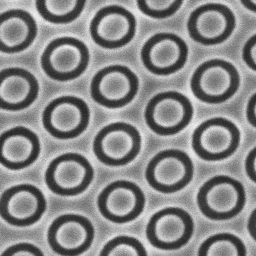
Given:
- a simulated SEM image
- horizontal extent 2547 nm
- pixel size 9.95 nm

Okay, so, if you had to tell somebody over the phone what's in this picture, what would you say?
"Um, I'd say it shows a regular array of ring-shaped grooves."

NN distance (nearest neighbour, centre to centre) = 0.559 microns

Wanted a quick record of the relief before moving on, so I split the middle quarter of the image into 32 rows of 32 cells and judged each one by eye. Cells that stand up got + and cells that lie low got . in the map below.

+++...+++++.....++++...+++....++
++...++++........++++........+++
.....+++...+++....++++.....+++++
...++++...++++++..++++++++++++++
.++++++..+++++++...+++++++++++++
+++++++..+++++++...++++++++++++.
+++++++..+++++++...+++++++++++++
+++++++...++++++..+++++.......++
....+++....+++....++++.........+
.....+++.........++++...+++++...
++....++++.....++++++..++++++...
++++..++++++++++++++...+++++++..
++++...+++++++++++++...+++++++..
++++...+++++++++++++...++++++...
++++..+++++++..+++++...++++++...
+++...++++.......++++....++....+
++...++++.........++++........++
....++++...+++++...++++.....++++
...+++++..+++++++..+++++++++++++
+++++++...+++++++..+++++++++++++
+++++++...+++++++..+++++++++++++
+++++++...++++++...++++++....+++
....++++...++++....++++........+
.....+++....++....++++..........
.++...+++........++++...+++++...
++++...++++....++++++..+++++++..
+++++..+++++++++++++...+++++++..
+++++...++++++++++++...+++++++..
+++++..+++++++++++++...++++++...
++++...+++++.....++++...++++....
+++...++++.........++..........+
.....++++....+++....+++......+++